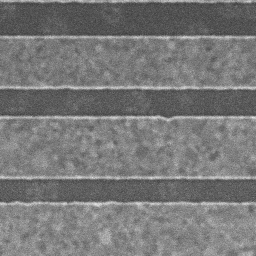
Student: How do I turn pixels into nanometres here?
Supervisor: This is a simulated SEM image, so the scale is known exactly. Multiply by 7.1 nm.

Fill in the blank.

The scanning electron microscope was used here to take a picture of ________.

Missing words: one or a few lines or trenches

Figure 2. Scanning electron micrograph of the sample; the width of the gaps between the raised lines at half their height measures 205 nanometres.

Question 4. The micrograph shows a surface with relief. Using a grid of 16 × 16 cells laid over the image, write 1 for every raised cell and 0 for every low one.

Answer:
0000000000000000
0000000000000000
1111111111111111
1111111111111111
1111111111111111
0000000000000000
0000000000000000
1111111111111111
1111111111111111
1111111111111111
1111111111111111
0000000000000000
0000000000000000
1111111111111111
1111111111111111
1111111111111111